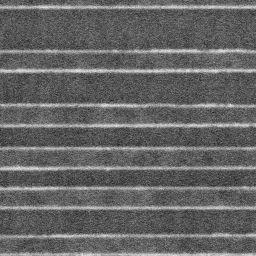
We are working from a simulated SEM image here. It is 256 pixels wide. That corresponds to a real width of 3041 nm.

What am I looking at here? lines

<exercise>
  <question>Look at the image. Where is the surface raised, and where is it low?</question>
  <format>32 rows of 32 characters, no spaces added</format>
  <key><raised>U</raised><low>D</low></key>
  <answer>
UUUUUUUUUUUUUUUUUUUUUUUUUUUUUUUU
DDDDDDDDDDDDDDDDDDDDDDDDDDDDDDDD
DDDDDDDDDDDDDDDDDDDDDDDDDDDDDDDD
DDDDDDDDDDDDDDDDDDDDDDDDDDDDDDDD
DDDDDDDDDDDDDDDDDDDDDDDDDDDDDDDD
DDDDDDDDDDDDDDDDDDDDDDDDDDDDDDDD
UUUUUUUUUUUUUUUUUUUUUUUUUUUUUUUU
UUUUUUUUUUUUUUUUUUUUUUUUUUUUUUUU
UUUUUUUUUUUUUUUUUUUUUUUUUUUUUUUU
DDDDDDDDDDDDDDDDDDDDDDDDDDDDDDDD
DDDDDDDDDDDDDDDDDDDDDDDDDDDDDDDD
DDDDDDDDDDDDDDDDDDDDDDDDDDDDDDDD
DDDDDDDDDDDDDDDDDDDDDDDDDDDDDDDD
UUUUUUUUUUUUUUUUUUUUUUUUUUUUUUUU
UUUUUUUUUUUUUUUUUUUUUUUUUUUUUUUU
UUUUUUUUUUUUUUUUUUUUUUUUUUUUUUUU
DDDDDDDDDDDDDDDDDDDDDDDDDDDDDDDD
DDDDDDDDDDDDDDDDDDDDDDDDDDDDDDDD
DDDDDDDDDDDDDDDDDDDDDDDDDDDDDDDD
UUUUUUUUUUUUUUUUUUUUUUUUUUUUUUUU
UUUUUUUUUUUUUUUUUUUUUUUUUUUUUUUU
DDDDDDDDDDDDDDDDDDDDDDDDDDDDDDDD
DDDDDDDDDDDDDDDDDDDDDDDDDDDDDDDD
DDDDDDDDDDDDDDDDDDDDDDDDDDDDDDUD
UUUUUUUUUUUUUUUUUUUUUUUUUUUUUUUU
UUUUUUUUUUUUUUUUUUUUUUUUUUUUUUUU
DDDDDDDDDDDDDDDDDDDDDDDDDDDDDDDD
DDDDDDDDDDDDDDDDDDDDDDDDDDDDDDDD
DDDDDDDDDDDDDDDDDDDDDDDDDDDDDDDD
DDDDDDUUUUUUUUUUUUUUUUUUUUUUUUUU
UUUUUUUUUUUUUUUUUUUUUUUUUUUUUUUU
UUUUUUUUUUUUUUUUUUUUUUUUUUUUUUUU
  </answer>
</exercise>